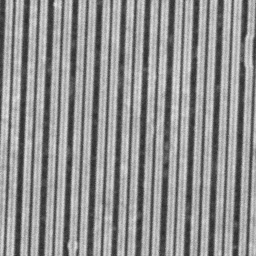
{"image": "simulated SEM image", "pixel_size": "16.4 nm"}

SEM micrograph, parallel lines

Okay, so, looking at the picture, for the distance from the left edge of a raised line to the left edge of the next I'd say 199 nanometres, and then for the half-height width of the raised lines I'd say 5.74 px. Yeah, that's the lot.